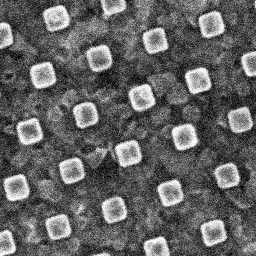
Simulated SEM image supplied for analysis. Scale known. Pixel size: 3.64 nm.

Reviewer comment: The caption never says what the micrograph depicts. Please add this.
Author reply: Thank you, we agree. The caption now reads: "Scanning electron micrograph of a regular array of raised bodies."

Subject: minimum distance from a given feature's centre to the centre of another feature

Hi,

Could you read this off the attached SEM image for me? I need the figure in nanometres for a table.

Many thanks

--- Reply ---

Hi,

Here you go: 210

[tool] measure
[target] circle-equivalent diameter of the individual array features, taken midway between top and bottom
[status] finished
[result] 86.8 nanometers